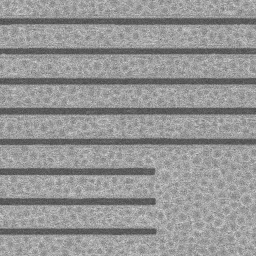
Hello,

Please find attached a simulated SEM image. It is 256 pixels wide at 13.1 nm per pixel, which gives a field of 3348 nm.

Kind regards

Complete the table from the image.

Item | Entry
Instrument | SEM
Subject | parallel lines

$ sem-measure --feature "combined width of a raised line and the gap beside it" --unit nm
392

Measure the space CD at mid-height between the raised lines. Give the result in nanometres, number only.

98.1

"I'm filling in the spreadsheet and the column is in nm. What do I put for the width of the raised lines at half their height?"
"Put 294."